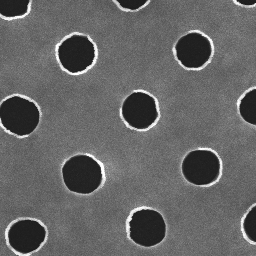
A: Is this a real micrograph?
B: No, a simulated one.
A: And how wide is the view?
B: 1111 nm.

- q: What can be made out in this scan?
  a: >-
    holes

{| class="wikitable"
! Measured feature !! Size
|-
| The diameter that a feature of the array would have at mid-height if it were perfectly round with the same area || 36.1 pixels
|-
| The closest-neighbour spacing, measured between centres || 351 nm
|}